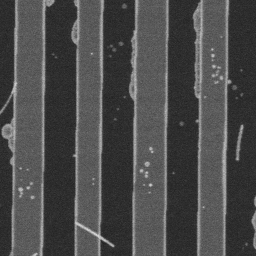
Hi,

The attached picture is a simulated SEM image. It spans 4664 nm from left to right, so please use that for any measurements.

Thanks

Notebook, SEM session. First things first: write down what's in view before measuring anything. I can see lines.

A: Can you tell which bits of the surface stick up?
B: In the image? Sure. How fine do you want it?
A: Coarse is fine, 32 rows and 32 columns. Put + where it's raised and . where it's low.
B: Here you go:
..++++....+++....++++....+++....
..++++....+++....++++....+++....
..++++....+++....++++....+++....
..+++.....+++....++++....+++....
..++++....+++....++++....+++....
..++++....+++....++++....+++....
..++++....+++....++++....+++....
..+++.....+++....++++....+++....
..+++.....+++....++++....+++....
..+++.....+++....++++....+++....
..+++.....+++....++++....+++....
..+++.....+++....++++....+++....
..+++.....+++....++++....+++....
..+++.....+++....++++....+++....
..+++.....+++....++++....+++....
..+++.....+++....++++....+++....
..+++.....+++....++++....+++....
..+++.....+++....++++....+++....
..+++.....+++....++++....+++....
..+++.....+++....++++....+++....
..+++.....+++....++++....+++....
..+++.....+++....++++....+++....
..+++.....+++....++++....+++....
..+++.....+++....++++....+++....
..+++.....++.....++++....+++....
..+++.....++.....++++....+++....
..+++.....++.....++++....+++....
..+++....+++.....++++....+++....
..+++....+++.....++++....+++....
..+++....++++....++++....+++....
..+++....++++....++++....+++....
..+++....+++.....++++....+++....